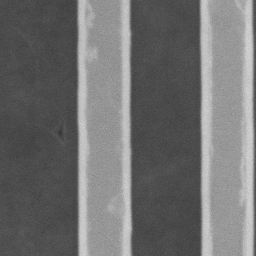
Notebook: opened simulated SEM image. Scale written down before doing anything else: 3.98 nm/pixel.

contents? wiring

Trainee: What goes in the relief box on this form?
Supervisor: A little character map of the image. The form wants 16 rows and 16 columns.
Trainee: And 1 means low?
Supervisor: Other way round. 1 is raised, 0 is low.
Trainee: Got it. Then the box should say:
0000011100000111
0000011100000111
0000011100000111
0000011100000111
0000011100000111
0000011100000111
0000011100000111
0000011100000111
0000011100000111
0000011100000111
0000011100000111
0000011100000111
0000011100000111
0000011100000111
0000011100000111
0000011100000111